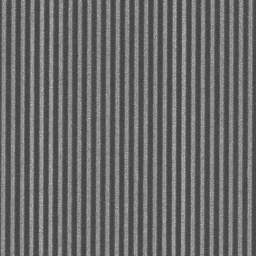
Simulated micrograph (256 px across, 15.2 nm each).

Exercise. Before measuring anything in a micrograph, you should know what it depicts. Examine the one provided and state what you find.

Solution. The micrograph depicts parallel lines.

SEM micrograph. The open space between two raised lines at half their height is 0.0777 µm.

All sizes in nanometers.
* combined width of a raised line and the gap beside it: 144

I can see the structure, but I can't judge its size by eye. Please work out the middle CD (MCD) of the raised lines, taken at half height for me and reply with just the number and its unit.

64.4 nanometres